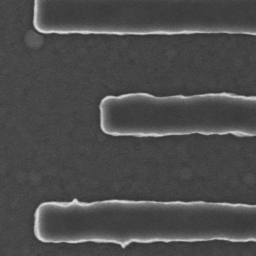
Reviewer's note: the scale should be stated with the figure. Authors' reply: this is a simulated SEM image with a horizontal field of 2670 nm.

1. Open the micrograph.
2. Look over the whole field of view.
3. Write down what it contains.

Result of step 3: one or a few lines or trenches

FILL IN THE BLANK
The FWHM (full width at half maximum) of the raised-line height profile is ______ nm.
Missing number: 396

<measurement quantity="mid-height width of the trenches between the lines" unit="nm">693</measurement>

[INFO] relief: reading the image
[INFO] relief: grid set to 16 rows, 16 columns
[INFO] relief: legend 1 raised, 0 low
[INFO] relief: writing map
0011111111111111
0011111111111111
0000000000000000
0000000000000000
0000000000000000
0000000000000000
0000001111111111
0000001111111111
0000000000000000
0000000000000000
0000000000000000
0000000000000000
0000000000000000
0011111111111111
0011111111111111
0000000000000000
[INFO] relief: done